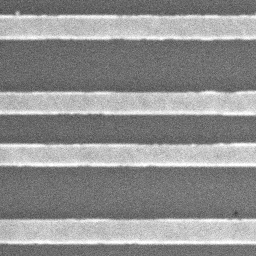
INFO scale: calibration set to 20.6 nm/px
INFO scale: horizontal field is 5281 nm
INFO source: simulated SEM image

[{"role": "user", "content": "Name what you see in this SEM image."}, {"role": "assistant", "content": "lines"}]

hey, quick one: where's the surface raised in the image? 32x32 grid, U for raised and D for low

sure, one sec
DDDDDDDDDDDDDDDDDDDDDDDDDDDDDDDD
DDDDDDDDDDDDDDDDDDDDDDDDDDDDDDDD
UUUUUUUUUUUUUUUUUUUUUUUUUUUUUUUU
UUUUUUUUUUUUUUUUUUUUUUUUUUUUUUUU
UUUUUUUUUUUUUUUUUUUUUUUUUUUUUUUU
DDDDDDDDDDDDDDDDDDDDDDDDDDDDDDDD
DDDDDDDDDDDDDDDDDDDDDDDDDDDDDDDD
DDDDDDDDDDDDDDDDDDDDDDDDDDDDDDDD
DDDDDDDDDDDDDDDDDDDDDDDDDDDDDDDD
DDDDDDDDDDDDDDDDDDDDDDDDDDDDDDDD
DDDDDDDDDDDDDDDDDDDDDDDDDDDDDDDD
DDDDDDDDDDDDDDDDDDDDDDDDDDDDDDDD
UUUUUUUUUUUUUUUUUUUUUUUUUUUUUUUU
UUUUUUUUUUUUUUUUUUUUUUUUUUUUUUUU
DDDDDDDDDDDDDDDDDDDDDDDDDDDDDDDD
DDDDDDDDDDDDDDDDDDDDDDDDDDDDDDDD
DDDDDDDDDDDDDDDDDDDDDDDDDDDDDDDD
DDDDDDDDDDDDDDDDDDDDDDDDDDDDDDDD
UUUUUUUUUUUUUUUUUUUUUUUUUUUUUUUU
UUUUUUUUUUUUUUUUUUUUUUUUUUUUUUUU
UUUUUUUUUUUUUUUUUUUUUUUUUUUUUUUU
DDDDDDDDDDDDDDDDDDDDDDDDDDDDDDDD
DDDDDDDDDDDDDDDDDDDDDDDDDDDDDDDD
DDDDDDDDDDDDDDDDDDDDDDDDDDDDDDDD
DDDDDDDDDDDDDDDDDDDDDDDDDDDDDDDD
DDDDDDDDDDDDDDDDDDDDDDDDDDDDDDDD
DDDDDDDDDDDDDDDDDDDDDDDDDDDDDDDD
DDDDDDDDDDDDDDDDDDDDDDDDDDDDDDDD
UUUUUUUUUUUUUUUUUUUUUUUUUUUUUUUU
UUUUUUUUUUUUUUUUUUUUUUUUUUUUUUUU
DDDDDDDDDDDDDDDDDDDDDDDDDDDDDDDD
DDDDDDDDDDDDDDDDDDDDDDDDDDDDDDDD